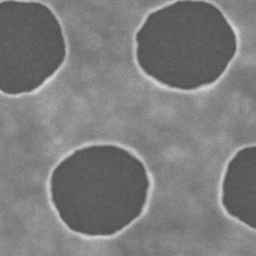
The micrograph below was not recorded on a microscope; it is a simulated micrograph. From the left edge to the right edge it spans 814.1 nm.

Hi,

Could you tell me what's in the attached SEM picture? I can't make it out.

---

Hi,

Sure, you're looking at holes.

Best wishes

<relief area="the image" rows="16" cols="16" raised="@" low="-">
---@@@@@@@----@@
----@@@@@-----@@
----@@@@-------@
----@@@@@------@
---@@@@@@-----@@
--@@@@@@@@@--@@@
@@@@@@@@@@@@@@@@
@@@@@@@@@@@@@@@@
@@@@@@@@@@@@@@@@
@@@@@---@@@@@@@-
@@@------@@@@@--
@@@------@@@@@--
@@@------@@@@@--
@@@@-----@@@@@@-
@@@@@--@@@@@@@@@
@@@@@@@@@@@@@@@@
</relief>